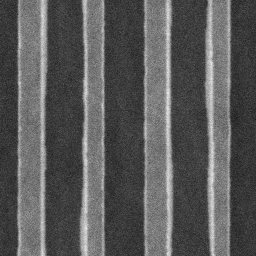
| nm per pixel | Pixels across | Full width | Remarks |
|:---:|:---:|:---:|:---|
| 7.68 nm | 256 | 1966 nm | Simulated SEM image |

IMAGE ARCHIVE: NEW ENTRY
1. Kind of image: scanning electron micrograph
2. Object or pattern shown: lines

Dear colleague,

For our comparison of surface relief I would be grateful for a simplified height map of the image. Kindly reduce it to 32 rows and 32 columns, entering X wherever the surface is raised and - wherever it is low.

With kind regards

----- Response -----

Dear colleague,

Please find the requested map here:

--XXX------XX-----XXX-----XXX---
--XXX------XX-----XXX-----XXX---
--XXX------XX-----XXX-----XXX---
--XXX------XX-----XXX-----XXX---
--XXX------XX-----XXX-----XXX---
--XXX------XX-----XXX-----XXX---
--XXX------XX-----XXX-----XXX---
--XXX------XX-----XXX-----XXX---
--XXX------XX-----XXX-----XXX---
--XXX------XX-----XXX-----XXX---
--XXX------XX-----XXX-----XXX---
--XXX------XX-----XXX-----XXX---
--XXX------XX-----XXX-----XXX---
--XXX------XX-----XXX-----XXX---
--XXX------XX-----XXX-----XXX---
--XXX------XX-----XXX-----XXX---
--XXX------XX-----XXX-----XXX---
--XXX------XX-----XXX-----XXX---
--XXX------XX-----XXX-----XXX---
--XXX------XX-----XXX-----XXX---
--XXX------XX-----XXX-----XXX---
--XXX------XX-----XXX-----XXX---
--XXX------XX-----XXX-----XXX---
--XXX------XX-----XXX-----XXX---
--XXX------XX-----XXX-----XXX---
--XXX------XX-----XXX-----XXX---
--XXX-----XXX-----XXX-----XXX---
--XXX-----XXX-----XXX-----XXX---
--XXX-----XXX-----XXX-----XXX---
--XXX-----XXX-----XXX-----XXX---
--XXX-----XXX-----XXX------XX---
--XXX-----XXX-----XXX------XX---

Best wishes